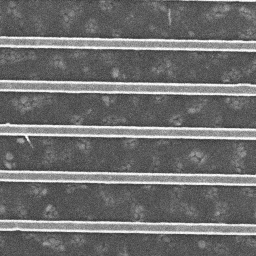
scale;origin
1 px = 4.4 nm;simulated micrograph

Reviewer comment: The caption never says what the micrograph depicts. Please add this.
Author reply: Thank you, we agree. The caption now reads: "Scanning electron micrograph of parallel lines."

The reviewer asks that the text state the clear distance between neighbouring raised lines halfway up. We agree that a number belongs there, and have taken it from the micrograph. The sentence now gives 159 nm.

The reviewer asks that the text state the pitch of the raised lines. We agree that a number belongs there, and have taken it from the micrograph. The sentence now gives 202 nanometers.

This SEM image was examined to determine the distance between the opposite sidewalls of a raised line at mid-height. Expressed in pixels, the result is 9.75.